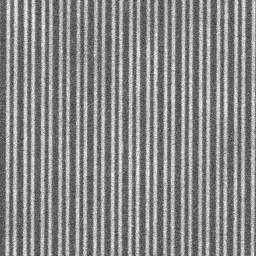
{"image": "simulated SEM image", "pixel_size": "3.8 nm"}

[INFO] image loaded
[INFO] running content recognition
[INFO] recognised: parallel lines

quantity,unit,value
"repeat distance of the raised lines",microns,0.0334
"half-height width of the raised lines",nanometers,10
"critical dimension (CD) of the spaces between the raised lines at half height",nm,22.8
